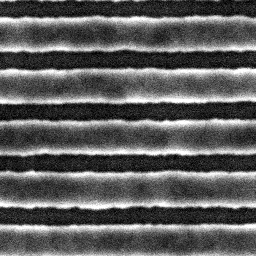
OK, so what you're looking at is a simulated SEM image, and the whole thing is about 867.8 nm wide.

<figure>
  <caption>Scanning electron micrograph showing lines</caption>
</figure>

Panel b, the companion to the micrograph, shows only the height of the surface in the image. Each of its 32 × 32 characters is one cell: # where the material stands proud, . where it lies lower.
................................
................................
################################
################################
################################
################################
................................
................................
................................
################################
################################
################################
################################
................................
................................
################################
################################
################################
################################
................................
................................
##.#................###.........
################################
################################
################################
################################
................................
................................
################################
################################
################################
################################